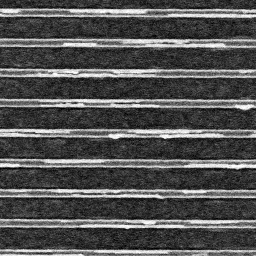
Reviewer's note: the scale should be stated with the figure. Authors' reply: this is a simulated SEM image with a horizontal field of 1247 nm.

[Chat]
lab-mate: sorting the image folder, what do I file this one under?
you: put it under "parallel lines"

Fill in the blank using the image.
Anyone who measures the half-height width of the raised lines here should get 36.5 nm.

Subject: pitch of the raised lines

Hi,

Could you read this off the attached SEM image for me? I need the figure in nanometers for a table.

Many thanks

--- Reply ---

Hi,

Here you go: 147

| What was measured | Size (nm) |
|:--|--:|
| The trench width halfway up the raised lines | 110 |